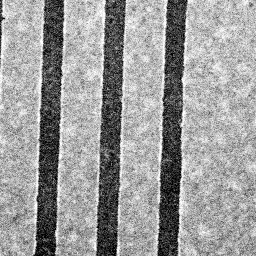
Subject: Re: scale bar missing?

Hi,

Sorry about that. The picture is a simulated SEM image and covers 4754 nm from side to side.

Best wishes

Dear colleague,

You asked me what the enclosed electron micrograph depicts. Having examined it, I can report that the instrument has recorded one or a few lines or trenches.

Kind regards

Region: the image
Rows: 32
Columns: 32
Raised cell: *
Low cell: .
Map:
*****...*****...*****..*********
*****...*****...*****..*********
*****...*****...*****..*********
*****...*****...*****..*********
*****...*****...*****..*****.***
*****...*****...*****..*********
*****...*****...*****..*********
*****...*****...****...*********
*****...*****..*****...*********
*****...*****..*****...*********
*****...*****..*****...*********
*****...*****..*****...*********
*****...*****..*****...*********
*****...*****..*****...*********
*****...*****..*****...*********
*****...*****..*****...*********
*****...*****..*****...*********
*****...****...*****...*********
*****...****...*****...*********
*****..*****...*****...*********
*****..*****...*****...*********
*****..*****...*****...*********
*****..*****...*****...*********
*****..*****...*****...*********
*****..*****...*****...*********
*****..*****...*****..**********
*****..*****...*****..**********
****...*****...*****...*********
****...*****...*****..**********
****...*****...*****..**********
****...*****...*****..**********
****...*****...*****..**********